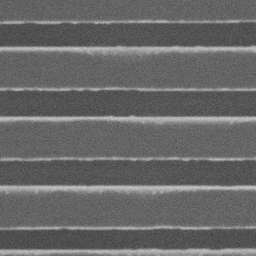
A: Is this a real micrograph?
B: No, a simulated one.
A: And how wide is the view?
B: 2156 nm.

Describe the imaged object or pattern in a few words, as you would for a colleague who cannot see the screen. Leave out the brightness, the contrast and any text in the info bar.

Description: lines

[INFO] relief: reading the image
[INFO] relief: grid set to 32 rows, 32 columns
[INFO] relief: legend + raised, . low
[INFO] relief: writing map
++++++++++++++++++++++++++++++++
++++++++++++++++++++++++++++++++
++++++++++++++++++++++++++++++++
................................
................................
................................
++++++++++++++++++++++++++++++++
++++++++++++++++++++++++++++++++
++++++++++++++++++++++++++++++++
++++++++++++++++++++++++++++++++
++++++++++++++++++++++++++++++++
................................
................................
................................
................................
++++++++++++++++++++++++++++++++
++++++++++++++++++++++++++++++++
++++++++++++++++++++++++++++++++
++++++++++++++++++++++++++++++++
++++++++++++++++++++++++++++++++
................................
................................
................................
++++++++++..++++.....+++++++++++
++++++++++++++++++++++++++++++++
++++++++++++++++++++++++++++++++
++++++++++++++++++++++++++++++++
++++++++++++++++++++++++++++++++
++++++++++++++++++++..+++++.+...
................................
................................
++++++++++++++++++++++++++++++++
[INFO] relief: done